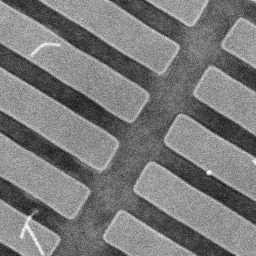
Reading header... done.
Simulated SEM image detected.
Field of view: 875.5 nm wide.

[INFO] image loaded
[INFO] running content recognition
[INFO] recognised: groups of lines, slits or small figures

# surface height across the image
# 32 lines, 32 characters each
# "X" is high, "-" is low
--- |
X-----XXXXXXXX-----XXXXXXX------
XX-----XXXXXXXXX-----XXXX-------
XXXX-----XXXXXXXX-----XXX-----X-
XXXXXX----XXXXXXXXX----------XXX
XXXXXXX-----XXXXXXXXX-------XXXX
XXXXXXXXX-----XXXXXXXX------XXXX
--XXXXXXXX-----XXXXXXX-------XXX
----XXXXXXXX-----XXXX---------XX
-----XXXXXXXXX-----XX-----X-----
XX-----XXXXXXXX----------XXXX---
XXXX----XXXXXXXXX--------XXXXX--
XXXXX-----XXXXXXXX------XXXXXXXX
XXXXXXX-----XXXXXX-------XXXXXXX
XXXXXXXX-----XXXXX---------XXXXX
-XXXXXXXXX-----XX-----X-----XXXX
---XXXXXXXXX----------XXX-----XX
-----XXXXXXXX--------XXXXX-----X
X-----XXXXXXXXX------XXXXXXX----
XXX-----XXXXXXX------XXXXXXXXX--
XXXXX----XXXXX---------XXXXXXXXX
XXXXXX-----XX------X----XXXXXXXX
XXXXXXXX----------XXX-----XXXXXX
-XXXXXXXXX-------XXXXXX-----XXXX
---XXXXXXXX------XXXXXXX-----XXX
----XXXXXXX-------XXXXXXXX-----X
X-----XXXX---------XXXXXXXXX----
XX-----XXX-----X-----XXXXXXXX---
XXXX----------XXX-----XXXXXXXXX-
XXXXXX-------XXXXXX-----XXXXXXXX
XXXXXXX------XXXXXXX------XXXXXX
-XXXXXX-------XXXXXXXX-----XXXXX
--XXXXX--------XXXXXXXXX-----XXX